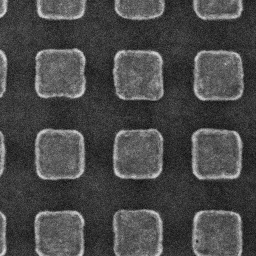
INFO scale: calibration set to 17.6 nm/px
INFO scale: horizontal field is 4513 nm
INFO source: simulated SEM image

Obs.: raised bodies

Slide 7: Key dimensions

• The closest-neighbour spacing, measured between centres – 1380 nm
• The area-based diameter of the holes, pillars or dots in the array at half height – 0.903 micrometres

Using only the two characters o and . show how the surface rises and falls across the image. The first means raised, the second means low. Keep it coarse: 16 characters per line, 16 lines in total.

..ooo..ooo..ooo.
................
................
..ooo..ooo...oo.
..ooo..ooo..ooo.
..ooo..ooo..ooo.
................
................
..ooo..ooo..ooo.
..ooo..ooo..ooo.
..ooo..ooo..ooo.
................
................
...oo..ooo..ooo.
..ooo..ooo..ooo.
..ooo..ooo..ooo.